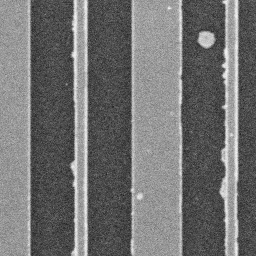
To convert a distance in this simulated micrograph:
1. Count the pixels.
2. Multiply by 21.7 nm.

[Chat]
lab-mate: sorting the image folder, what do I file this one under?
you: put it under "lines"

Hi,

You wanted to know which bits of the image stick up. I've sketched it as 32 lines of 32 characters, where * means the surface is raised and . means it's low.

****.....**......******.....**..
****.....**......******.....**..
****.....**......******.....**..
****.....**......******.....**..
****.....**......******..*..**..
****.....**......******.....**..
****.....**......******.....**..
****.....**......******.....**..
****.....**......******.....**..
****.....**......******.....**..
****.....**......******.....**..
****.....**......******.....**..
****.....**......******.....**..
****.....**......******.....**..
****.....**......******.....**..
****.....**......******.....**..
****.....**......******.....**..
****.....**......******.....**..
****.....**......******.....**..
****.....**......******.....**..
****.....**......******.....**..
****.....**......******.....**..
****.....**......******.....**..
****.....**......******.....**..
****.....**......******.....**..
****.....**......******.....**..
****.....**......******.....**..
****.....**......******.....**..
****.....**......******.....**..
****.....**......******.....**..
****.....**.....*******.....**..
****.....**.....*******.....**..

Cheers